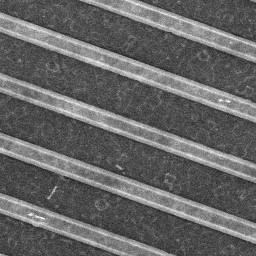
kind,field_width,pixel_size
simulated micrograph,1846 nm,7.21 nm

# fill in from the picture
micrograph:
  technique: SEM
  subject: parallel lines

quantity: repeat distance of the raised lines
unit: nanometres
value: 410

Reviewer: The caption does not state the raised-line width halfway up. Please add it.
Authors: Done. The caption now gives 106 nm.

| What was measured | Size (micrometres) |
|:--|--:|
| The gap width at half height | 0.303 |